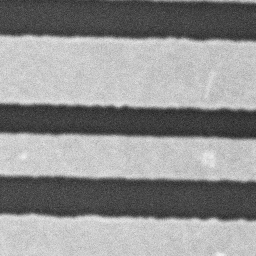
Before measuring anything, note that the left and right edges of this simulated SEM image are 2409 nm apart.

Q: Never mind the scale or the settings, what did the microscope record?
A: lines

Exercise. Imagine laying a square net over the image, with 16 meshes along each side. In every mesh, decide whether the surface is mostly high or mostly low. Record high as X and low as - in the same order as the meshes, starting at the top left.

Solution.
----------------
----------------
XXXXXXXX-XX-----
XXXXXXXXXXXXXXXX
XXXXXXXXXXXXXXXX
XXXXXXXXXXXXXXXX
----XXXXXXXXXXXX
----------------
XXXXX-----------
XXXXXXXXXXXXXXXX
XXXXXXXXXXXXXXXX
----------------
----------------
XX--------------
XXXXXXXXXXXXXXXX
XXXXXXXXXXXXXXXX